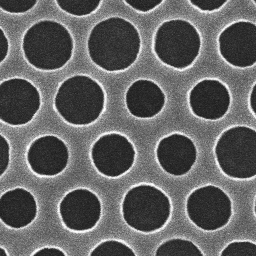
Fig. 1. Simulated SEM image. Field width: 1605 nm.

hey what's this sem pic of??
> a regular array of holes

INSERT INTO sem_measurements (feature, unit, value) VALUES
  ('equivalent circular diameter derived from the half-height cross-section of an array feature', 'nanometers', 274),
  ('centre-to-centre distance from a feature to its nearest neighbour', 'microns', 0.394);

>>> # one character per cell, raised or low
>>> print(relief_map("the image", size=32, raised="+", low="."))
....+++.....++++....++++....++++
+..+++++...+++++++++++++++++++++
+++++++++++++...++++++++++++++++
++++....++++.....+++....++++....
.++......++......+++.....++.....
.++......++.......+......++.....
.++......++......+++.....++.....
++++.....+++.....+++....++++....
+++++..++++++...++++++.+++++++++
++++++++++.+++++++++++++++++++++
....++++....+++++..++++++...++++
.....++......+++....++++.....++.
.....++......+++.....+++.....++.
.....++......+++....++++....+++.
....++++....+++++..++++++...++++
+..++++++..+++++++++++++++++++++
++++++++++++++++++++++++++++....
.++++...++++....++++....+++.....
.+++....++++.....+++....+++.....
.++......++......+++.....++.....
.+++....++++.....+++....+++.....
.+++...++++++...+++++..+++++....
++++++++++++++++++++++++++++++++
+++++++++++++++++..++++++..+++++
....++++....++++.....+++....++++
.....++......++......++......+++
.....+++.....++......++......+++
....++++....++++.....+++.....+++
++.++++++..++++++...+++++..+++++
++++++++++++++++++++++++++++++++
+++++++++++++..+++++....+++++...
.++++...+++......+++.....+++....